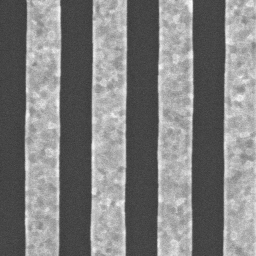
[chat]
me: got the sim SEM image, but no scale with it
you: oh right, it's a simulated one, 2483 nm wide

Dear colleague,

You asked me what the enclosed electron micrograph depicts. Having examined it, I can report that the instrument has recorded wiring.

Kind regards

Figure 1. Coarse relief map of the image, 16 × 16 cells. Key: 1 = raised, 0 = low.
0011001100110011
0011001100110011
0011001100110011
0011001100110011
0011001100110011
0011001100110011
0011001100110011
0011001100110011
0011001100110011
0011001100110011
0011001100110011
0011001100110011
0011001100110011
0011001100110011
0011001100110011
0011001100110011